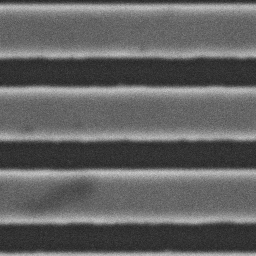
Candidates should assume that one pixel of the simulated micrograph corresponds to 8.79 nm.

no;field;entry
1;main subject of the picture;lines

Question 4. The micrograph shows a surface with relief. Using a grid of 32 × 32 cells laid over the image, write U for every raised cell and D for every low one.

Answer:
DDDDDDDDDDDDDDDDDDDDDDDDDDDDDDDD
UUUUUUUUUUUUUUUUUUUUUUUUUUUUUUUU
UUUUUUUUUUUUUUUUUUUUUUUUUUUUUUUU
UUUUUUUUUUUUUUUUUUUUUUUUUUUUUUUU
UUUUUUUUUUUUUUUUUUUUUUUUUUUUUUUU
UUUUUUUUUUUUUUUUUUUUUUUUUUUUUUUU
UUUUUUUUUUUUUUUUUUUUUUUUUUUUUUUU
DDDDDDDDDDDDDDDDDDDDDDDDDDDDDDDD
DDDDDDDDDDDDDDDDDDDDDDDDDDDDDDDD
DDDDDDDDDDDDDDDDDDDDDDDDDDDDDDDD
DDDDDDDDDDDDDDDDDDDDDDDDDDDDDDDD
UUUUUUUUUUUUUUUUUUUUUUUUUUUUUUUU
UUUUUUUUUUUUUUUUUUUUUUUUUUUUUUUU
UUUUUUUUUUUUUUUUUUUUUUUUUUUUUUUU
UUUUUUUUUUUUUUUUUUUUUUUUUUUUUUUU
UUUUUUUUUUUUUUUUUUUUUUUUUUUUUUUU
UUUUUUUUUUUUUUUUUUUUUUUUUUUUUUUU
DDDDDDUUDDUUDDDDDDDDDDDDDDDDDDDD
DDDDDDDDDDDDDDDDDDDDDDDDDDDDDDDD
DDDDDDDDDDDDDDDDDDDDDDDDDDDDDDDD
DDDDDDDDDDDDDDDDDDDDDDDDDDDDDDDD
UUUUUUUUUUUUUUUUUUUUUUUUUUUUUUUU
UUUUUUUUUUUUUUUUUUUUUUUUUUUUUUUU
UUUUUUUUUUUUUUUUUUUUUUUUUUUUUUUU
UUUUUUUUUUUUUUUUUUUUUUUUUUUUUUUU
UUUUUUUUUUUUUUUUUUUUUUUUUUUUUUUU
UUUUUUUUUUUUUUUUUUUUUUUUUUUUUUUU
UUUUUUUUUUUUUUUUUUUUUUUUUUUUUUUU
DDDDDDDDDDDDDDDDDDDDDDDDDDDDDDDD
DDDDDDDDDDDDDDDDDDDDDDDDDDDDDDDD
DDDDDDDDDDDDDDDDDDDDDDDDDDDDDDDD
DDDDDDDDDDDDDDDDDDDDDDDDDDDDDDDD